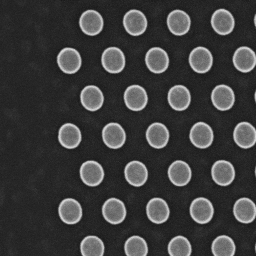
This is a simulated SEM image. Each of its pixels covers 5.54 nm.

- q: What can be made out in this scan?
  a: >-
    a regular array of raised bodies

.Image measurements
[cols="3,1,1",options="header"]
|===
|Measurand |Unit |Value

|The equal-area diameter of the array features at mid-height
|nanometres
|128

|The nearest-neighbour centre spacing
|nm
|240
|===